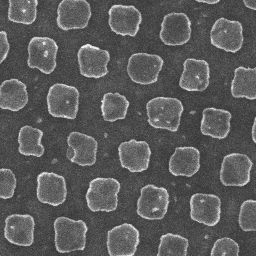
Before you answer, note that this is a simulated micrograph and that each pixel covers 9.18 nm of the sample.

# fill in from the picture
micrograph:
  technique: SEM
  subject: a regular array of raised bodies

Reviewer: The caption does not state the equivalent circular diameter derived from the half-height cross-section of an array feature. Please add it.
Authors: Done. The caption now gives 293 nm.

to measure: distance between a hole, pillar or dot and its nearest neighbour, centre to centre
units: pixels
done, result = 49.6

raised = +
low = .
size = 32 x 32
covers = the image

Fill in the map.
.++++...+++....................+
.++++..++++...+++...............
.+++...++++...++++..+++....+....
........+.....+++...++++...+++..
+...................++++..++++..
+...+++..............++....+++..
+...+++...+++...................
....+++...++++..++++....+.......
....+++...+++...++++...+++......
...........++...++++...+++...+++
+++...................++++...+++
+++...++++...................+++
+++...++++...+++...+++..........
+++...++++...+++..+++++.........
.......++....+++..+++++..++++...
...................+++...++++...
..+++....................++++...
..+++....+++....................
..+++....+++...++++...++........
.........+++...++++...+++...+++.
..........++...+++...++++...+++.
+....................+++....+++.
++...+++....++..............+++.
++...+++...++++...++............
+....+++...++++...+++...+++.....
......+....++++..++++...++++..++
.................++++...+++...++
.+++...++...............+++...++
.+++...++++...+++.............++
.+++...++++..++++....+..........
..++...++++..++++...+++....+++..
..............+++...+++...++++..